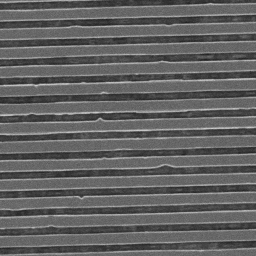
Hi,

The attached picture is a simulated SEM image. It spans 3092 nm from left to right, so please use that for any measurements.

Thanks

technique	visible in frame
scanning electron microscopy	parallel lines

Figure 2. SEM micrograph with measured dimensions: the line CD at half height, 0.137 um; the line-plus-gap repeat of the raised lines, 227 nanometers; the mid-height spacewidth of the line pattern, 92.1 nm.